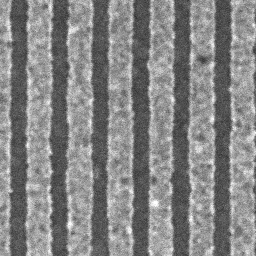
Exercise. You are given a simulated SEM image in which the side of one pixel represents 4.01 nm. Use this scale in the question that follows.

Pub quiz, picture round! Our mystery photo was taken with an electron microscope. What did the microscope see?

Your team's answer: parallel lines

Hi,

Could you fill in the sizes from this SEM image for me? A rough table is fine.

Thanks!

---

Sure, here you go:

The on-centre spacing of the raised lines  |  40.7 pixels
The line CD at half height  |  0.0902 microns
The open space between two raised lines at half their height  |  0.0731 µm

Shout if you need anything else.